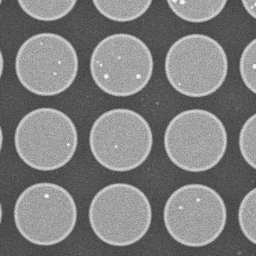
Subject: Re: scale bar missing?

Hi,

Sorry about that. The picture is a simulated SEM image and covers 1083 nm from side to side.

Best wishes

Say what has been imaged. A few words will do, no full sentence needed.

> an array of small figures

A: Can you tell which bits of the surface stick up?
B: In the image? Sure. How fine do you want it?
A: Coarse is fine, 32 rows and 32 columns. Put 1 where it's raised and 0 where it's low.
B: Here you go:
00111111100011111110011111110011
00011111100011111100001111110001
00000110000000110000000111000000
00000000000000000000000000000000
00001111000000111000000111000000
00011111100011111100001111100001
00111111100011111110011111110011
00111111110111111110011111110011
00111111110111111110011111110011
00111111100011111110011111110011
00011111100011111100011111110001
00001111000001111000000111100000
00000000000000000000000000000000
00000000000000000000000000000000
00011111000001111100001111100000
00111111100011111100011111110001
00111111110111111110011111110011
00111111110111111110011111110011
00111111100111111110011111110011
00111111100011111100011111110011
00011111000001111100001111100001
00000000000000000000000000000000
00000000000000000000000000000000
00011111000001111000000111000000
00111111100011111100011111100001
00111111100111111110011111110011
00111111110111111110011111110011
00111111110111111110011111110011
00111111100111111110011111110011
00011111000011111100011111100001
00000110000000110000000111000000
00000000000000000000000000000000